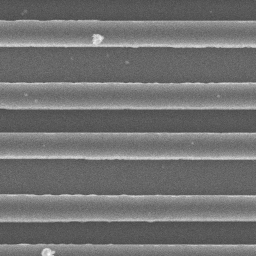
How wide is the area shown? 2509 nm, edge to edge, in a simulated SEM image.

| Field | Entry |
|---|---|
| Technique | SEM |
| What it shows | lines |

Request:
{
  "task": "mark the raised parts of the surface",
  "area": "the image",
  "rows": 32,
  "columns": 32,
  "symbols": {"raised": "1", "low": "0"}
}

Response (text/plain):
00000000000000000000000000000000
00000000000000000000000000000000
00000000000000000000000000000000
11111111111111111111111111111111
11111111111111111111111111111111
11111111111111111111111111111111
00000000000000000000000000000000
00000000000000000000000000000000
00000000000000000000000000000000
00000000000000000000000000000000
11111111111111111111000111111111
11111111111111111111111111111111
11111111111111111111111111111111
11111111111111111111111111111111
00000000000000000000000000000000
00000000000000000000000000000000
00000000000000000000000000000000
11111111111111111111111111111111
11111111111111111111111111111111
11111111111111111111111111111111
00000000000000000000000000000000
00000000000000000000000000000000
00000000000000000000000000000000
00000000000000000000000000000000
11111111111111111111111111111111
11111111111111111111111111111111
11111111111111111111111111111111
11111111111111111111111111111111
00000000000000000000000000000000
00000000000000000000000000000000
00000000000000000000000000000000
11111111111111111111111111111111